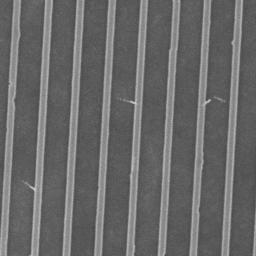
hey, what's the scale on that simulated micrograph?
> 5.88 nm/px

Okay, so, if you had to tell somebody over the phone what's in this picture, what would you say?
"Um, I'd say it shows parallel lines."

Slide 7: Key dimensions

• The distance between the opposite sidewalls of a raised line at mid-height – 35.9 nm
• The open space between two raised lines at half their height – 150 nanometres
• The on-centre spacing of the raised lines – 186 nm